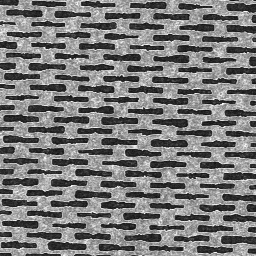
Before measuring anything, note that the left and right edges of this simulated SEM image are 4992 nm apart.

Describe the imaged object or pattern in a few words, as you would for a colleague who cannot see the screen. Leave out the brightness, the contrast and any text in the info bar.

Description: a regular array of holes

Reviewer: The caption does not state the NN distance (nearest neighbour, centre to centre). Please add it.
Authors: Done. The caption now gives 410 nm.